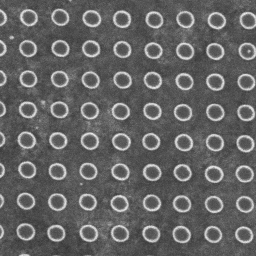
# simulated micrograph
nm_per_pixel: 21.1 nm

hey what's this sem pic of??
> a regular array of raised bodies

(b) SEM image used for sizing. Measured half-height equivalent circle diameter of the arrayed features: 339 nm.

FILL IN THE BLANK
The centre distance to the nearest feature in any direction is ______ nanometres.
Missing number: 637